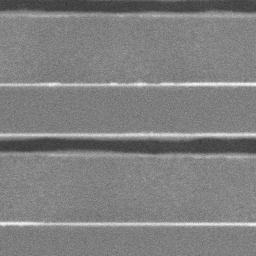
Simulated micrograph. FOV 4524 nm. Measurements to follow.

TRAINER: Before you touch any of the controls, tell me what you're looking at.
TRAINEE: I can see lines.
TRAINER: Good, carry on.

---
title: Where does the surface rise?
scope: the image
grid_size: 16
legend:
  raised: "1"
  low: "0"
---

0000000000000000
1111111111111111
1111111111111111
1111111111111111
1111111111111111
1111111111111111
1111111111111111
1111111111111111
0000000000000000
0000000000000000
1111111111111111
1111111111111111
1111111111111111
1111111111111111
1111111111111111
1111111111111111